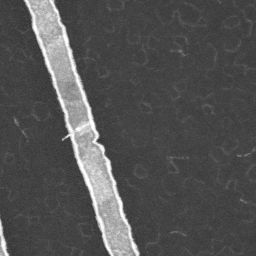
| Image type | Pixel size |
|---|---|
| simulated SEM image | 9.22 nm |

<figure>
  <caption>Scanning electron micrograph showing one or a few lines or trenches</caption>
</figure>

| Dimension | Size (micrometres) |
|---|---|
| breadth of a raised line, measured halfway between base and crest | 0.215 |